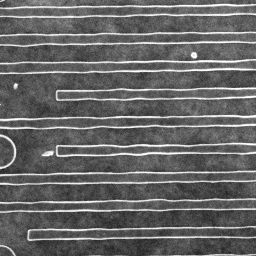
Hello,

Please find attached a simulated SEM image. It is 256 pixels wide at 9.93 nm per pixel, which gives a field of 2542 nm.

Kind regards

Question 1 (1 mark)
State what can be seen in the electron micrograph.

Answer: groups of lines, slits or small figures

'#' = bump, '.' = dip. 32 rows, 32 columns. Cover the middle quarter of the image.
################################
################################
................................
................................
................................
................................
.............###........###.....
################################
################################
................................
................................
................................
................................
..####.....#####################
################################
######################..#####..#
................................
................................
................................
................................
........####.....#####...#####..
################################
##############...###............
................................
................................
................................
................................
..##############################
################################
#########################.......
................................
................................